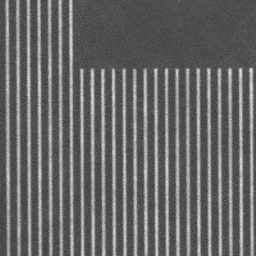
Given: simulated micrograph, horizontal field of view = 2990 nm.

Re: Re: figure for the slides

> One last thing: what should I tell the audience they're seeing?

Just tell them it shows parallel lines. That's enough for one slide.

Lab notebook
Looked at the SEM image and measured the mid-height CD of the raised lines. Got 23.4 nm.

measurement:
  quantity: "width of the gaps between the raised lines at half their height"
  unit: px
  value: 8.88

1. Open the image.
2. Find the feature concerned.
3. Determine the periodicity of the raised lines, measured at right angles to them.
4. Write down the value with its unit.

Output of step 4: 0.124 µm